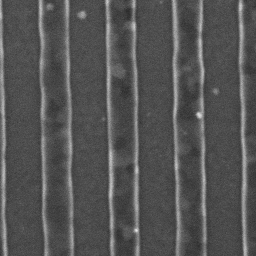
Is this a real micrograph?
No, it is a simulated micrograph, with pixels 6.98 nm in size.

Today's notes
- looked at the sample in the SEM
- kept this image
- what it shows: wiring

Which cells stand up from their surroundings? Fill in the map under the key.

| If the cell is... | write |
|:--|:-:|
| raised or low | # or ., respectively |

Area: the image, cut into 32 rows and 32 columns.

.....###.....####.....###.....##
.....###.....####.....###.....##
.....###.....####.....###.....##
.....###.....####.....###.....##
.....###.....####.....###.....##
.....###......###.....###.....##
.....###......###.....###.....##
.....####.....###.....###.....##
.....####.....###.....###.....##
.....####.....###.....###.....##
.....####.....###.....###.....##
.....####.....###.....###.....##
.....####.....###.....###.....##
.....####.....###.....###.....##
#....####.....###.....###.....##
#....####.....###.....###.....##
#....####.....###.....###.....##
#....####.....###.....###.....##
#....####.....###.....###.....##
#....####.....###.....###.....##
#....####.....###.....###.....##
#....####.....###.....###.....##
#....####.....###.....####.....#
.....####.....###.....####....##
.....####.....###.....###.....##
.....####.....###.....###.....##
.....####.....###.....####....##
#....####.....###.....####....##
#.....###.....###.....####....##
#.....###.....###.....####.....#
#.....###.....###.....####.....#
#.....###.....###.....####.....#